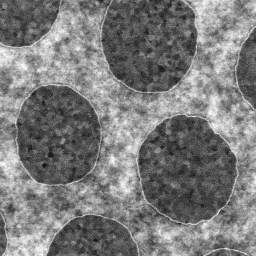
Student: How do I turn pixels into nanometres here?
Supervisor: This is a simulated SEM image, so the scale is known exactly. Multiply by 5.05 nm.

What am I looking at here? raised bodies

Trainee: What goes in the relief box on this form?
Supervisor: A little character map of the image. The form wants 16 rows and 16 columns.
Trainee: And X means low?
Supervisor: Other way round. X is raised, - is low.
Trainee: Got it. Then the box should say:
XXXX---XXXXX----
XXX---XXXXXX----
XX----XXXXXX---X
-------XXXXX---X
-------XXXXX---X
--XX----XXX----X
-XXXXX----------
-XXXXX----XXX---
-XXXXX---XXXXX--
-XXXXX---XXXXXX-
--XXXX---XXXXXX-
---X-----XXXXXX-
---------XXXXX--
-----X----XXX---
----XXXX--------
---XXXXXX-------